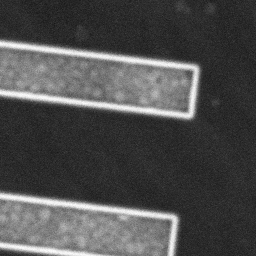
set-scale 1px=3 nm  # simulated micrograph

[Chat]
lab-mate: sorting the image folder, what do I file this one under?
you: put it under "one or a few lines or trenches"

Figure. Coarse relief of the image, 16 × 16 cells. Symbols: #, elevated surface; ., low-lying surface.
################
################
################
......##########
............####
............####
######......####
################
################
################
################
################
..##############
..........######
...........#####
##.........#####